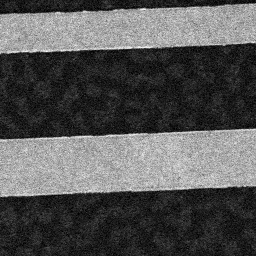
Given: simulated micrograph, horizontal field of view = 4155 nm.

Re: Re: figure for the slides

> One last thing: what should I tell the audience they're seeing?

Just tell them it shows one or a few lines or trenches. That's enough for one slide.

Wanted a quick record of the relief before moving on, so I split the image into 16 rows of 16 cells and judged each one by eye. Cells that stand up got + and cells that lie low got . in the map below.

...........+++++
++++++++++++++++
++++++++++++++++
................
................
................
................
................
.......+++++++++
++++++++++++++++
++++++++++++++++
++++++++++++++++
................
................
................
................